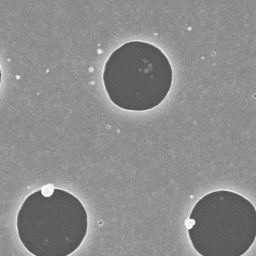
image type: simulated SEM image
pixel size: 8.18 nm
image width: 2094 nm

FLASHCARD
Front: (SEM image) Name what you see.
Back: holes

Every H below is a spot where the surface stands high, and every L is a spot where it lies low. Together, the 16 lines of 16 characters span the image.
HHHHHHHHHHHHHHHH
HHHHHHHHHHHHHHHH
HHHHHHHHHHHHHHHH
HHHHHHHLLLHHHHHH
HHHHHHLLLLLHHHHH
HHHHHHHLLLLHHHHH
HHHHHHHLLLHHHHHH
HHHHHHHHHHHHHHHH
HHHHHHHHHHHHHHHH
HHHHHHHHHHHHHHHH
HHHHHHHHHHHHHHHH
HHHHHHHHHHHHHHHH
HHLLLHHHHHHHHLLH
HLLLLHHHHHHHLLLL
HLLLLHHHHHHHLLLL
HHLLLHHHHHHHLLLL